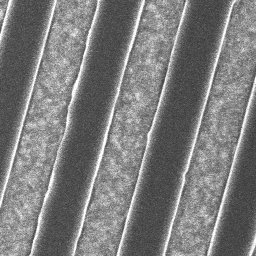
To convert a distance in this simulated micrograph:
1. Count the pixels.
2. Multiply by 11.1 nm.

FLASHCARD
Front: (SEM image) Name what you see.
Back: one or a few lines or trenches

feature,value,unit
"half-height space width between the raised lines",468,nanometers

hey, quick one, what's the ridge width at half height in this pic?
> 497 nm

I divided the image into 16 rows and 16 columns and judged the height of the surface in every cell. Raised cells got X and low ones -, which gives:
-XX---XXX---XX--
XXX---XXX--XXX--
XXX--XXX---XXX--
XXX--XXX---XXX--
XX---XXX--XXX---
XX---XX---XXX---
XX--XXX---XXX---
X---XXX---XXX--X
X---XXX--XXX---X
X---XX---XXX---X
X--XXX---XXX--XX
---XXX---XX---XX
---XXX--XXX---XX
---XX---XXX---XX
--XXX---XXX--XXX
--XXX--XXX---XXX